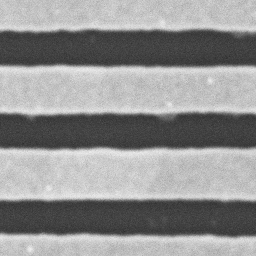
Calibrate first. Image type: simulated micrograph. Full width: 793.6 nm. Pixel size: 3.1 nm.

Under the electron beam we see lines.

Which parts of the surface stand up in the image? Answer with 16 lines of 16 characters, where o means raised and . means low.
oooooooooooooooo
oooooooooooooooo
................
................
oooooooooooooooo
oooooooooooooooo
oooooooooooooooo
................
................
oooooooooooooooo
oooooooooooooooo
oooooooooooooooo
...............o
................
................
oooooooooooooooo